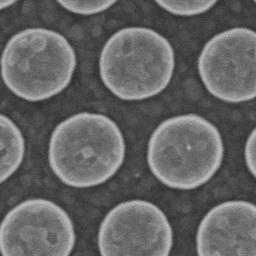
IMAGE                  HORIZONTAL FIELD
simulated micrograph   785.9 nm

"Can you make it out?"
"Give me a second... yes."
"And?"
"raised bodies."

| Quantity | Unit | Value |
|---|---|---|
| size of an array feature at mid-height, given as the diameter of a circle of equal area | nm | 220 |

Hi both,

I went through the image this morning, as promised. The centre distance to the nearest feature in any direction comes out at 303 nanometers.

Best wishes